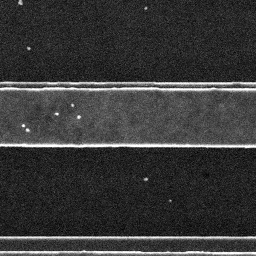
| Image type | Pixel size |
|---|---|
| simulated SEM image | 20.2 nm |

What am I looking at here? lines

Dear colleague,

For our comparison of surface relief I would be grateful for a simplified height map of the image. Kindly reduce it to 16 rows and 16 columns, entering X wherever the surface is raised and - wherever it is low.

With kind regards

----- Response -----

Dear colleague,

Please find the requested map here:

----------------
----------------
----------------
----------------
----------------
XXXXXXXXXXXXXXXX
XXXXXXXXXXXXXXXX
XXXXXXXXXXXXXXXX
XXXXXXXXXXXXXXXX
----------------
----------------
----------------
----------------
----------------
----------------
XXXXXXXXXXXXXXXX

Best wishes